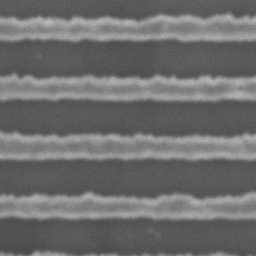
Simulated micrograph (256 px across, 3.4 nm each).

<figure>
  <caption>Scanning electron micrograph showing lines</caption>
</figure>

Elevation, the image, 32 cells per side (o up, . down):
................................
................................
oo..o.o..o..oo....ooooooo.oooooo
oooooooooooooooooooooooooooooooo
oooooooooooooooooooooooooooooooo
................................
................................
................................
................................
.o..............................
oooooooooooooooooooooooooooooooo
oooooooooooooooooooooooooooooooo
..........................o.....
................................
................................
................................
................................
oooooooooooooooooooooooooooooooo
oooooooooooooooooooooooooooooooo
oooooooooooooooooooooooooooooooo
................................
................................
................................
................................
....o.....oo..........o........o
oooooooooooooooooooooooooooooooo
oooooooooooooooooooooooooooooooo
................................
................................
................................
................................
................................